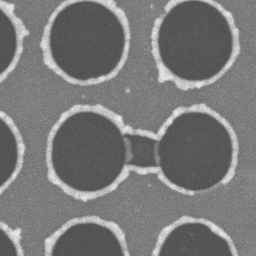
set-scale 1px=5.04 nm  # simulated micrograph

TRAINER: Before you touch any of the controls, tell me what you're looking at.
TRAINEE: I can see holes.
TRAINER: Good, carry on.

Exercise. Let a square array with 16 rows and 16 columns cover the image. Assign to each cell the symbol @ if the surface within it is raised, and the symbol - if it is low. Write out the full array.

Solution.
@@@@---@@@@--@@@
-@@-----@@----@@
-@@-----@@-----@
-@@-----@@----@@
@@@@---@@@@---@@
@@@@@@@@@@@@@@@@
@@@@@@@@@@@@@@@@
@@@@---@@@@---@@
-@@------@----@@
-@@------------@
-@@-----@@----@@
@@@@---@@@@---@@
@@@@@@@@@@@@@@@@
@@@@@@@@@@@@@@@@
@@@@---@@@@--@@@
-@@-----@@----@@